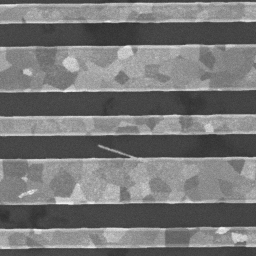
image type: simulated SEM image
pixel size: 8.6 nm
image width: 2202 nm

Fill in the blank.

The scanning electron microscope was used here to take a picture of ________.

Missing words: wiring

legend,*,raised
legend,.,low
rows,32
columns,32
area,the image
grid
.............*******************
********************************
********************************
................................
................................
................................
********************************
********************************
********************************
********************************
********************************
................................
................................
................................
..............******************
********************************
********************************
................................
................................
................................
********************************
********************************
********************************
********************************
********************************
******..***.....................
................................
................................
........................********
********************************
********************************
................................